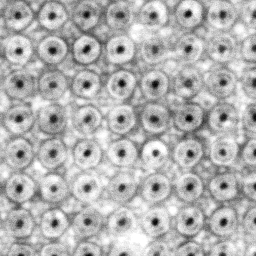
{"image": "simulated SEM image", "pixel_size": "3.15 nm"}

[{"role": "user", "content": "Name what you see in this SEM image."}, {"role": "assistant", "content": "a regular array of ring-shaped raised bodies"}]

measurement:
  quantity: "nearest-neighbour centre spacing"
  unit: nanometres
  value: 105